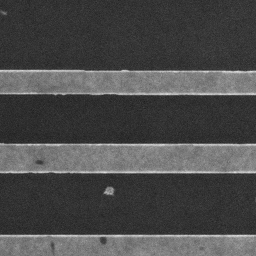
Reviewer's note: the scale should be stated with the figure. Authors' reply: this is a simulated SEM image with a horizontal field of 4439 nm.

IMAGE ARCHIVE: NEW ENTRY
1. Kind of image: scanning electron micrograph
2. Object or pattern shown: lines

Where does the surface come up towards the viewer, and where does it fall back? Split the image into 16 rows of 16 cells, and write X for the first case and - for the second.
----------------
----------------
----------------
----------------
XXXXXXXXXXXXXXXX
XXXXXXXXXXXXXXXX
----------------
----------------
----------------
XXXXXXXXXXXXXXXX
XXXXXXXXXXXXXXXX
----------------
----------------
----------------
----------------
XXXXXXXXXXXXXXXX